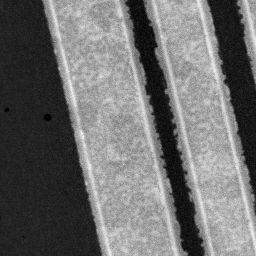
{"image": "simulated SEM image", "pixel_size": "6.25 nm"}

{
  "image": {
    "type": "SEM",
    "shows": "one or a few lines or trenches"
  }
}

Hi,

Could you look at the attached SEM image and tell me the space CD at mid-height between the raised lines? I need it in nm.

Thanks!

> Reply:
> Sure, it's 216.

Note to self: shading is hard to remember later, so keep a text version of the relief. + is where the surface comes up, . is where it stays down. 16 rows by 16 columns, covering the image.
...++++...+++..+
....++++..+++...
....++++..+++...
....++++..+++...
....++++...++...
....+++++..+++..
.....++++..+++..
.....++++..+++..
.....++++...++..
.....+++++..+++.
......++++..+++.
......++++..+++.
......++++...++.
......+++++..+++
.......++++..+++
.......++++..+++